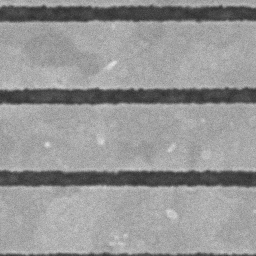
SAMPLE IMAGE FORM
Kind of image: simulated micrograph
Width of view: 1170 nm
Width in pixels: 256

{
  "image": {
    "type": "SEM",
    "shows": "lines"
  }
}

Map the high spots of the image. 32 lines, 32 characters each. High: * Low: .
********************************
................................
................................
********************************
********************************
********************************
********************************
********************************
********************************
********************************
********************************
................................
................................
********************************
********************************
********************************
********************************
********************************
********************************
********************************
********************************
................................
................................
********************************
********************************
********************************
********************************
********************************
********************************
********************************
********************************
********************************